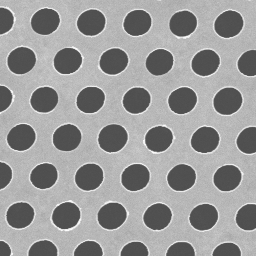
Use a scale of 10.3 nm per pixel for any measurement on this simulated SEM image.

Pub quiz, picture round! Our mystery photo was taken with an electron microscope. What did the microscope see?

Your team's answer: a regular array of holes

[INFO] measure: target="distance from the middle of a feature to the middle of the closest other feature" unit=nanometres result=463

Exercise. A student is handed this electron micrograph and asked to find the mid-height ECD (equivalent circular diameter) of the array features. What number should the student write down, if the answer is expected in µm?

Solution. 0.282